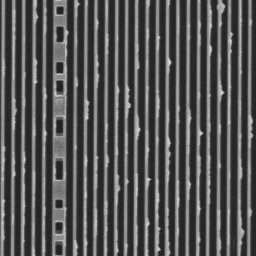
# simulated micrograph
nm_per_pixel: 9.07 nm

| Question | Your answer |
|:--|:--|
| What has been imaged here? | parallel lines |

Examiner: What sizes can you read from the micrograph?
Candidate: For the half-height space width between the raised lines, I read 6.88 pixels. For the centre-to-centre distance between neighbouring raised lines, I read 10.3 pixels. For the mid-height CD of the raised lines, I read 31.8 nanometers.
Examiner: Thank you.